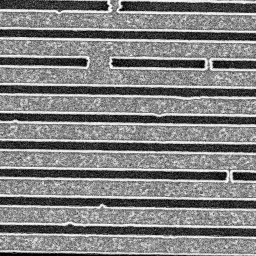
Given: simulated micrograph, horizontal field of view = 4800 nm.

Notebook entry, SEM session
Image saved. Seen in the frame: parallel lines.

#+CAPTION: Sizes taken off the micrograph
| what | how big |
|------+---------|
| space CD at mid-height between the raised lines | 180 nm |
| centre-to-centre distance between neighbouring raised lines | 524 nm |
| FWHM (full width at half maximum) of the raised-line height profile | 342 nanometres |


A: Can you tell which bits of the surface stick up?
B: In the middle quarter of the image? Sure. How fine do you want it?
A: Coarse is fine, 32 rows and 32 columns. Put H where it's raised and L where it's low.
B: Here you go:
LLLLLLHHHHHHLLLLLLLLLLLLLLLLLLLL
HHHHHHHHHHHHHHHHHHHHHHHHHHHHHHHH
HHHHHHHHHHHHHHHHHHHHHHHHHHHHHHHH
HHHHHHHHHHHHHHHHHHHHHHHHHHHHHHHH
HHHHHHHHHHHHHHHHHHHHHHHHHHHHHHHH
LLLLLLLLLLLLLLLLLLHHHHLLLHHHHHHH
LLLLLLLLLLLLLLLLLLLLLLLLLLLLLLLL
LLLLLLLLLLLLLLLLLLLLLLLLLLLLLLLL
HHHHHHHHHHHHHHHHHHHHHHHHHHHHHLLL
HHHHHHHHHHHHHHHHHHHHHHHHHHHHHHHH
HHHHHHHHHHHHHHHHHHHHHHHHHHHHHHHH
HHHHHHHHHHHHHHHHHHHHHHHHHHHHHHHH
LLLLLLLLLLLLLLLLHHHHHHHHHHHHHHHH
LLLLLLLLLLLLLLLLLLLLLLLLLLLLLLLL
LLLLLLLLLLLLLLLLLLLLLLLLLLLLLLLL
HHHHHHHHHHHHHHHHHHHHHHHHHHHHHHHH
HHHHHHHHHHHHHHHHHHHHHHHHHHHHHHHH
HHHHHHHHHHHHHHHHHHHHHHHHHHHHHHHH
HHHHHHHHHHHHHHHHHHHHHHHHHHHHHHHH
LLLLLLLLLLLLLLLLLLHHHHLHHHHHHHHH
LLLLLLLLLLLLLLLLLLLLLLLLLLLLLLLL
LLLLLLLLLLLLLLLLLLLLLLLLLLLLLLLL
HHHHHHHHHHHHHHHHHHHHHHHHHHHHHHHH
HHHHHHHHHHHHHHHHHHHHHHHHHHHHHHHH
HHHHHHHHHHHHHHHHHHHHHHHHHHHHHHHH
HHHHHHHHHHHHHHHHHHHHHHHHHHHHHHHH
LLLLLLLLLLLLLLLLLLLLLHHHHHHHHHHH
LLLLLLLLLLLLLLLLLLLLLLLLLLLLLLLL
LLLLLLLLLLLLLLLLLLLLLLLLLLLLLLLL
HHHHHHHHHHHHHHHHHHHHHHHHHHHHHHHH
HHHHHHHHHHHHHHHHHHHHHHHHHHHHHHHH
HHHHHHHHHHHHHHHHHHHHHHHHHHHHHHHH